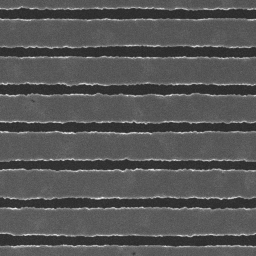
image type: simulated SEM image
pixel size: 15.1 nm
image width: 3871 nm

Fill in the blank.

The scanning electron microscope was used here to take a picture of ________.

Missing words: parallel lines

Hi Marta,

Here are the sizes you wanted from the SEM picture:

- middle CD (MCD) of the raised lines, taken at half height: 423 nm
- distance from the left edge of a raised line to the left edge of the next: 570 nm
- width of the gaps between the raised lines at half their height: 151 nanometres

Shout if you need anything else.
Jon